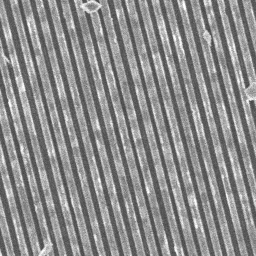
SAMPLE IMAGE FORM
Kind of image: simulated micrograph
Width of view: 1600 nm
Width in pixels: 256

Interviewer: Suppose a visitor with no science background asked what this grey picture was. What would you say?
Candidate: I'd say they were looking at parallel lines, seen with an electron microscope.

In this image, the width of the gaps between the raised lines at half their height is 37.1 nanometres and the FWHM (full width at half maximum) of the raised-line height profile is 43.3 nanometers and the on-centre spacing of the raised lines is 78.6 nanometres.